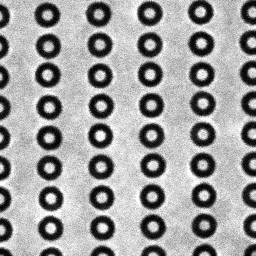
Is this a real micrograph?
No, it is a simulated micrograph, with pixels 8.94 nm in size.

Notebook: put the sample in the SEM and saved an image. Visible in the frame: a regular array of ring-shaped grooves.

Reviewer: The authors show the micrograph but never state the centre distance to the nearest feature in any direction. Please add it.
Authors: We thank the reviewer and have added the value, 268 nm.